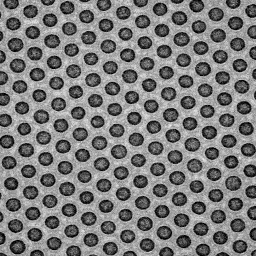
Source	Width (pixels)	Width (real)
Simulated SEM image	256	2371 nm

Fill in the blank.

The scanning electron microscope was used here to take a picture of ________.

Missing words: a regular array of holes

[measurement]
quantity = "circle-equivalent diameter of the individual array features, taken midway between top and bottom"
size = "137 nm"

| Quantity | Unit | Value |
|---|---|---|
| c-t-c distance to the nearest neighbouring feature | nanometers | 195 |